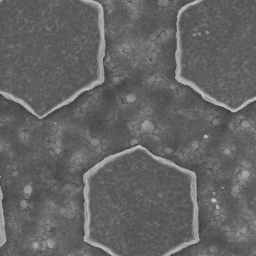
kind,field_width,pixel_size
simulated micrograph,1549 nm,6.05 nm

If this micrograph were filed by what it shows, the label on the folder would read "raised bodies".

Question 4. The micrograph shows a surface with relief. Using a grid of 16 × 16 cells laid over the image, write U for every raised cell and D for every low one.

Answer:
UUUUUUDDDDDDUUUU
UUUUUUDDDDDUUUUU
UUUUUUDDDDDUUUUU
UUUUUUDDDDDUUUUU
UUUUUUDDDDDUUUUU
UUUUUDDDDDDDUUUU
DUUUDDDDDDDDDDUD
DDDDDDDDDDDDDDDD
DDDDDDDDDDDDDDDD
DDDDDDDDUDDDDDDD
DDDDDDUUUUUDDDDD
DDDDDUUUUUUUDDDD
DDDDDUUUUUUUDDDD
DDDDDUUUUUUUDDDD
DDDDDUUUUUUUDDDD
DDDDDDUUUUUDDDDD